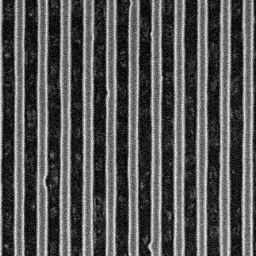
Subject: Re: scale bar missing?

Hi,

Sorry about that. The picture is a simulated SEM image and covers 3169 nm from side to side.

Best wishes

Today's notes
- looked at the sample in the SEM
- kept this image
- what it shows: parallel lines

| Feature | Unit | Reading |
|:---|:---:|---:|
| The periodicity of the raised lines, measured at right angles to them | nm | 283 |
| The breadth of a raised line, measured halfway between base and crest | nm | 118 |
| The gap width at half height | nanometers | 170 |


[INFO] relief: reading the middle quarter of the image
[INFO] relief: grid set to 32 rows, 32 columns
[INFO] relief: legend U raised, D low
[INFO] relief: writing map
UUDDDUUDDDDUUDDDUUUDDDUUDDDDUUDD
UDDDDUUDDDDUUDDDUUUDDDUUDDDDUUDD
UDDDDUUDDDDUUDDDUUUDDDUUDDDDUUDD
UDDDDUUDDDDUUDDDUUUDDDUUUDDDUUDD
UDDDDUUDDDDUUDDDUUUDDDUUDDDDUUDD
UDDDDUUDDDDUUDDDUUUDDDUUDDDDUUDD
UDDDDUUDDDDUUDDDUUUDDDUUDDDDUUDD
UDDDDUUDDDDUUDDDUUUDDDUUDDDDUUDD
UDDDDUUDDDDUUDDDUUUDDDUUDDDDUUDD
UDDDDUUDDDDUUDDDUUUDDDUUDDDDUUDD
UDDDDUUDDDDUUDDDUUDDDDUUDDDDUUDD
UDDDDUUDDDDUUDDDUUDDDDUUDDDDUUDD
UDDDDUUDDDDUUDDDUUDDDDUUDDDDUUDD
UDDDDUUDDDDUUDDDUUDDDDUUDDDDUUDD
UDDDDUUDDDDUUDDDUUDDDDUUDDDDUUDD
UDDDDUUDDDDUUDDDUUDDDDUUDDDDUUDD
UDDDDUUDDDDUUDDDUUDDDDUUDDDDUUDD
UDDDDUUDDDDUUDDDUUDDDDUUDDDDUUDD
UDDDDUUDDDDUUDDDUUDDDDUUDDDDUUDD
UDDDDUUDDDDUUDDDUUDDDDUUDDDDUUDD
UDDDDUUDDDDUUDDDUUDDDDUUDDDDUUDD
UDDDDUUDDDDUUDDDUUDDDDUUDDDDUUDD
UDDDDUUDDDDUUDDDUUDDDDUUDDDDUUDD
UDDDDUUDDDDUUDDDUUDDDDUUDDDDUUDD
UDDDDUUDDDDUUDDDUUDDDDUUDDDDUUDD
UDDDDUUDDDDUUDDDUUDDDDUUDDDDUUDD
UDDDDUUDDDDUUDDDUUDDDDUUDDDDUUDD
UDDDDUUDDDDUUDDDUUDDDDUUDDDDUUDD
UDDDDUUDDDDUUDDDUUDDDDUUDDDDUUDD
UDDDDUUDDDDUUDDDUUDDDDUUDDDDUUDD
UDDDDUUDDDDUUDDDUUDDDDUUDDDDUUDD
UDDDDUUDDDDUUDDDUUDDDDUUDDDDUUDD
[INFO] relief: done